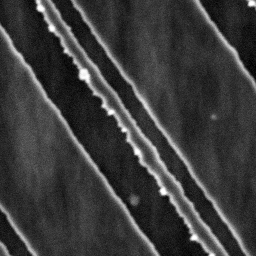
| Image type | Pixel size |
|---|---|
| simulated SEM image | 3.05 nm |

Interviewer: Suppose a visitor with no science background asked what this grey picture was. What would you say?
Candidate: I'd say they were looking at lines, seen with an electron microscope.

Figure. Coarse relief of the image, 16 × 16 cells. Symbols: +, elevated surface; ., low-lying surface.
..+++++++++++...
...++++++++++...
+...++++++++++..
+...+++++++++++.
++...++++++++++.
+++...++++++++++
+++...++++++++++
++++...+++++++++
+++++...++++++++
+++++...++++++++
++++++...+++++++
+++++++...++++++
+++++++....+++++
++++++++...+++++
+++++++++...++++
++++++++++...+++